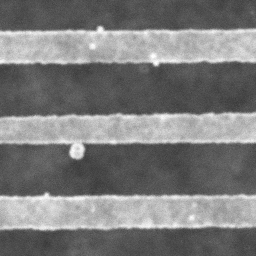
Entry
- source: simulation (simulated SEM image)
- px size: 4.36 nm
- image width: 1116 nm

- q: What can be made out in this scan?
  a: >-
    lines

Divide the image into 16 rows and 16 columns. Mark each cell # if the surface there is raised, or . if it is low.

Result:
................
................
################
################
................
................
................
################
################
................
................
................
################
################
................
................